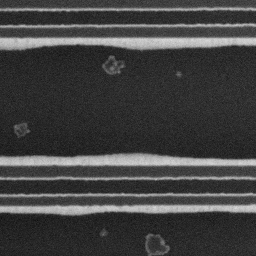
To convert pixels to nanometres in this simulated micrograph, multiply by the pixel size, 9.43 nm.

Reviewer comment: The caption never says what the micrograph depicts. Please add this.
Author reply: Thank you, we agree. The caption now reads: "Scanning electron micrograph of lines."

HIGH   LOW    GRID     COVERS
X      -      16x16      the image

XXXXXXXXXXXXXXXX
XXXXXXXXXXXXXXXX
XXXXXXXXXXXXXXXX
----------------
----------------
----------------
----------------
----------------
----------------
----------------
XXXXXXXXXXXXXXXX
XXXXXXXXXXXXXXXX
XXXXXXXXXXXXXXXX
----------------
----------------
----------------